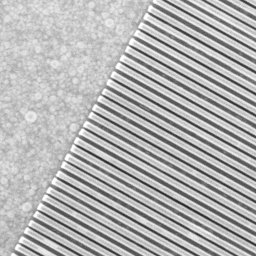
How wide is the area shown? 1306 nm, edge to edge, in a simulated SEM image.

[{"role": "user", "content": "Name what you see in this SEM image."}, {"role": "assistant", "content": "parallel lines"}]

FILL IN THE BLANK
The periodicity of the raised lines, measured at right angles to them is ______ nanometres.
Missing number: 47.5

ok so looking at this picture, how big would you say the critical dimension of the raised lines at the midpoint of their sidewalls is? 29.6 nanometres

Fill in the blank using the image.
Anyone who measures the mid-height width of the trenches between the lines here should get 20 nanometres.